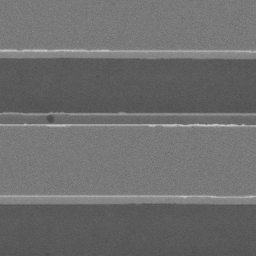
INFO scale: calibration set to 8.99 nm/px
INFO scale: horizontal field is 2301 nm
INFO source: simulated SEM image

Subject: lines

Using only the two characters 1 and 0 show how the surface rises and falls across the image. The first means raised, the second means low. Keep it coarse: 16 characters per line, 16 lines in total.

1111111111111111
1111111111111111
1111111111111111
0000000000000000
0000000000000000
0000000000000000
0000000000000000
1111111111111111
1111111111111111
1111111111111111
1111111111111111
1111111111111111
0000000000000000
0000000000000000
0000000000000000
0000000000000000